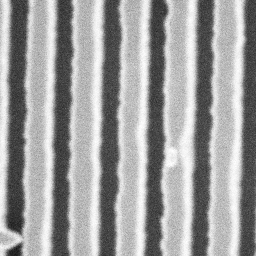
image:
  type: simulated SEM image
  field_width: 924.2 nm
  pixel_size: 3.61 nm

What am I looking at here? lines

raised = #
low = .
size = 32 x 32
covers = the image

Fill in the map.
#...###..####..####..###...###..
#...###..####..####..###...###..
#...###..####..####..###...###..
#...###..####..####..###...###..
#...###..####..####..###...###..
#..####..####..###...###...###..
#..####..####..####..###...###..
#..####..####..###...###...###..
#..####..####..###...###...###..
#..####..####..###...###...###..
#..####..####..###...###...###..
#..####..####..###...###...###..
#..####..###...###...###...###..
#..####..####..###...###...###..
#..####..####..###...###...###..
#..####..###...###...###...###..
#..####..###...###...###..####..
#..####..###...###...###..####..
#..####..###...###...###..####..
#..####..###...###...###..####..
#..####..###...###...###..####..
#..####..###...###..####..####..
#..####..###...###..####..####..
#..####..###...###..####..####..
#..###...###...###..####..####..
#..####..###...###...###..####..
#..###...###...###...###..####..
#..###...###...###..####..####..
#..###...###...###..####..####..
##.###...###...###..####..####..
##.###...###...###..####..####..
#..###...###...###..####..####..